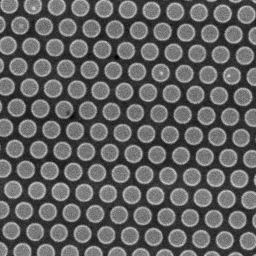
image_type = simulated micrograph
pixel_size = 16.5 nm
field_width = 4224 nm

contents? an array of small figures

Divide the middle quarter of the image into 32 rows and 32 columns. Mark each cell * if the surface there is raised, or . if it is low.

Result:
***.****...***...***...***...**.
**..*****.****..****..****..****
**...***..****..****..****..****
......*....**....***..****..****
..**.........................**.
.****..****...***...**....**....
.****..****..****..****..****..*
.****..****..****..****..****..*
........**....**...****..****..*
*...............................
**..****..***....**....**.......
**..****..****..****..****..****
**..****..****..****..****..****
.....**...***...***...****..****
.............................**.
.****..***...***....*...........
.****..****..****..***...***...*
.****..****..****.*****.*****.**
.***...***...***...***..****..**
....................*....***...*
*...***...***....*..............
**..****.****...***..****...***.
**.*****.****..****..****..****.
*...***...***...***..****..****.
................**....**....***.
.***...***....*.................
*****.****..****..****...**....*
****..****..****..****..****..**
.***...***..****..****..****..**
..............*....***...***..**
*...**....**....................
*..****..****..****..***....**..